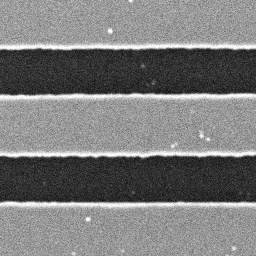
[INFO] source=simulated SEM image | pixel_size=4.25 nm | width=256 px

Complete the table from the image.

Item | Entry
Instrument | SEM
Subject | lines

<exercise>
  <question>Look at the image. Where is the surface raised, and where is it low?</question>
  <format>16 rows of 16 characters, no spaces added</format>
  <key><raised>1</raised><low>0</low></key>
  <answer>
1111111111111111
1111111111111111
1111111111111111
0000000000000000
0000000000000000
0000000000000000
1111111111111111
1111111111111111
1111111111111111
1111111111111111
0000000000000000
0000000000000000
0000000000000000
1111111111111111
1111111111111111
1111111111111111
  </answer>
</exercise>